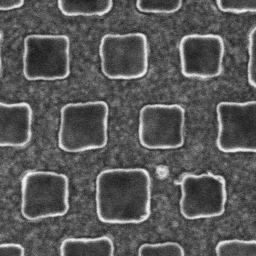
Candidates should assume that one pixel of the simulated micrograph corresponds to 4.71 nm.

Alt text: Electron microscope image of a regular array of raised bodies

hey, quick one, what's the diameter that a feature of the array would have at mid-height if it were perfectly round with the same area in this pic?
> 232 nm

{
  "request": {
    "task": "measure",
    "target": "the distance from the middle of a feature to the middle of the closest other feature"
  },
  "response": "368 nm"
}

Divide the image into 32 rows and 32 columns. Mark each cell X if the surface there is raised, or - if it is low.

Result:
XXX----XXXXXXX---XXXXXX----XXXXX
--------XXXXX-------X-----------
--------------------------------
--------------------------------
----XXX------XXXXX------XXX----X
---XXXXXX----XXXXX-----XXXXX---X
---XXXXXX----XXXXX-----XXXXX---X
---XXXXXX----XXXXX-----XXXXX---X
---XXXXXX----XXXXX-----XXXXX---X
---XXXXX-----XXXXX-------XX----X
--------------------------------
--------------------------------
--------------------------------
XXXX----XXXXX-----XXXXX----XXXXX
XXXX----XXXXX-----XXXXX----XXXXX
XXXX----XXXXX-----XXXXX----XXXXX
XXXX----XXXXX----XXXXXX----XXXXX
XXXX---XXXXXX----XXXXXX----XXXXX
--------XXXX-------X-------XXXXX
--------------------------------
--------------------------------
----X--------XXXXX--------------
---XXXXX----XXXXXXX----XXXXX----
---XXXXX----XXXXXXX----XXXXX----
---XXXXX----XXXXXXX----XXXXX----
---XXXXX----XXXXXXX---XXXXXX----
---XXXXX----XXXXXXX----XXXXX----
-------------XXXXX--------------
--------------------------------
--------------------------------
--------XXXXXX------XX-----XXXXX
XXX-----XXXXXX---XXXXXX----XXXXX